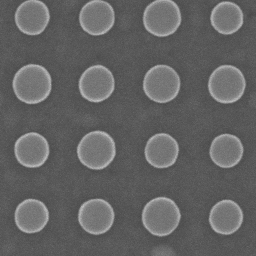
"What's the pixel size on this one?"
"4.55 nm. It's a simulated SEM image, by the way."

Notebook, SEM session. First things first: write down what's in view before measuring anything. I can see a regular array of raised bodies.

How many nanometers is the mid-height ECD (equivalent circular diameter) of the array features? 158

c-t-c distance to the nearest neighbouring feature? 294 nm